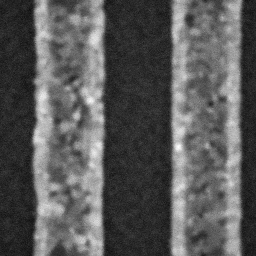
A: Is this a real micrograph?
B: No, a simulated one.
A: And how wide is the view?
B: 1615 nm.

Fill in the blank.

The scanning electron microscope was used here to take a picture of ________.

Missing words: one or a few lines or trenches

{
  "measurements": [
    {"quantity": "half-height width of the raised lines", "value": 356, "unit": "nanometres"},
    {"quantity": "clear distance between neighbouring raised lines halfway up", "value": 506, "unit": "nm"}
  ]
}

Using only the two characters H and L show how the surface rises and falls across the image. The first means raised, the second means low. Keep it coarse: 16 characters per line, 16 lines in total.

LLHHHHLLLLLHHHHL
LLLHHHLLLLLHHHHL
LLLHHHLLLLLHHHHL
LLLHHHLLLLLHHHHL
LLLHHHLLLLLHHHHL
LLHHHHLLLLLHHHHL
LLLHHHLLLLLHHHHL
LLLHHHLLLLLHHHHL
LLHHHHLLLLLHHHHL
LLHHHHLLLLLHHHHL
LLHHHHLLLLLHHHHL
LLHHHHLLLLLHHHHL
LLLHHHLLLLLHHHHL
LLLHHHLLLLLHHHHL
LLHHHHLLLLLHHHHL
LLHHHHLLLLLHHHHL